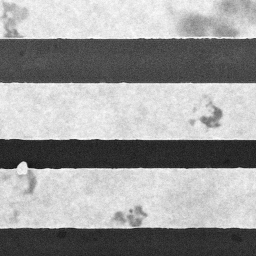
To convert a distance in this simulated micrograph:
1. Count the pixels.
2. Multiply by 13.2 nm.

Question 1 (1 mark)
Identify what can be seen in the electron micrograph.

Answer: lines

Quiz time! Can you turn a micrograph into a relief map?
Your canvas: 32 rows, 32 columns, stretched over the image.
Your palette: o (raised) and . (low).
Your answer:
oooooooooooooooooooooooooooooooo
oooooooooooooooooooooooooooooooo
oooooooooooooooooooooooooooooooo
oooooooooooooooooooooooooooooooo
oooooooooooooooooooooooooooooooo
................................
................................
................................
................................
................................
oooooooooooooooooooooooooooooooo
oooooooooooooooooooooooooooooooo
oooooooooooooooooooooooooooooooo
oooooooooooooooooooooooooooooooo
oooooooooooooooooooooooooooooooo
oooooooooooooooooooooooooooooooo
oooooooooooooooooooooooooooooooo
................................
................................
................................
..o.............................
oooooooooooooooooooooooooooooooo
oooooooooooooooooooooooooooooooo
oooooooooooooooooooooooooooooooo
oooooooooooooooooooooooooooooooo
oooooooooooooooooooooooooooooooo
oooooooooooooooooooooooooooooooo
oooooooooooooooooooooooooooooooo
................................
................................
................................
................................